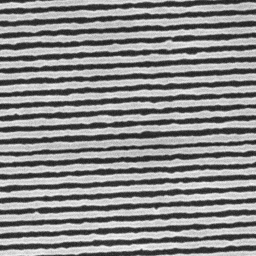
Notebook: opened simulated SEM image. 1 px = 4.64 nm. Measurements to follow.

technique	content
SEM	parallel lines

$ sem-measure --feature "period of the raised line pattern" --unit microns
0.0547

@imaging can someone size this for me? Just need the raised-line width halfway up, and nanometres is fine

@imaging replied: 28.4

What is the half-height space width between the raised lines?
29 nm